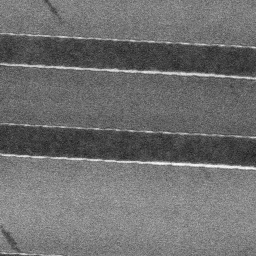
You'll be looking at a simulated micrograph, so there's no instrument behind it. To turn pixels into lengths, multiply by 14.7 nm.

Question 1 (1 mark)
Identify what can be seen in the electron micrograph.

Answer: lines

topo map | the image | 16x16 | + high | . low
................
................
++++++++........
++++++++++++++++
.........+++++++
................
................
................
++++++++++++++..
++++++++++++++++
...............+
................
................
................
................
................